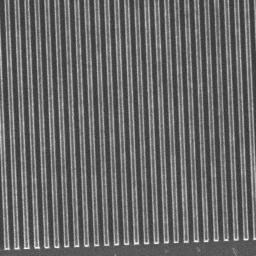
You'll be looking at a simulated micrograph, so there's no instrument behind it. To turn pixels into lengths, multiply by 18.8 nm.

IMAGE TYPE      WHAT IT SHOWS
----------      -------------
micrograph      parallel lines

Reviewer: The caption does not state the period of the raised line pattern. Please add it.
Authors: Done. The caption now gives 0.187 µm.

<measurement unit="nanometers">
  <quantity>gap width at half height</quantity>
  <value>103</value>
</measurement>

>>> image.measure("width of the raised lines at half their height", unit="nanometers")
84.4